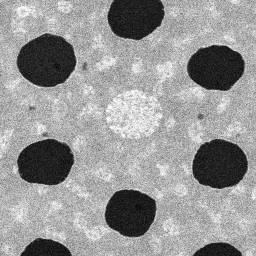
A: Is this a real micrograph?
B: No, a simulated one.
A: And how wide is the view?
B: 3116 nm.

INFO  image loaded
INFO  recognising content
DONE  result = holes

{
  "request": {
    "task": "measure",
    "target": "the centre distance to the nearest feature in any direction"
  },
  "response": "1200 nm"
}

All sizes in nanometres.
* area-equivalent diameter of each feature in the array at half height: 626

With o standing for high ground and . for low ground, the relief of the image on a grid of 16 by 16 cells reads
ooooooo...oooooo
ooooooo...oooooo
oo..oooooooooooo
o....ooooooo...o
o....ooooooo...o
ooooooooooooo.oo
oooooooooooooooo
oooooooooooooooo
oooooooooooooooo
o...oooooooo...o
o...oooooooo...o
oo..ooooooooo..o
ooooooo...oooooo
ooooooo...oooooo
ooooooo..ooooooo
oo..ooooooooo..o